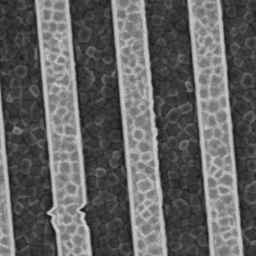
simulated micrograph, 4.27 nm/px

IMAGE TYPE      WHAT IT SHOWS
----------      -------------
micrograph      one or a few lines or trenches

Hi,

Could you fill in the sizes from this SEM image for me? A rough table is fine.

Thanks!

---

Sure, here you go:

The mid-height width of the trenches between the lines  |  199 nm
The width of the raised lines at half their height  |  125 nanometers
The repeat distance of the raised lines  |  324 nanometers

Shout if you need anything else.